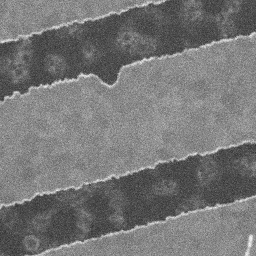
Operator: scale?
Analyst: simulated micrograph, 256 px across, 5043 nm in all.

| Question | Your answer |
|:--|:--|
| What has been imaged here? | one or a few lines or trenches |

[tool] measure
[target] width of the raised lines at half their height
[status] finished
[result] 2040 nm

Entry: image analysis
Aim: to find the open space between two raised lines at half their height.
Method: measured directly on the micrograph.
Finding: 54.9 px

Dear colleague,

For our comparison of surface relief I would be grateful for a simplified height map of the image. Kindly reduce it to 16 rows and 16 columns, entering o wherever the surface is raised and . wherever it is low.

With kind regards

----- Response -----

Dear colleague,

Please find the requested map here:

oooooooo........
oooo............
o.............oo
..........oooooo
........oooooooo
..oooooooooooooo
oooooooooooooooo
oooooooooooooooo
oooooooooooooooo
ooooooooooooo...
ooooooooo.......
ooooo...........
oo.............o
...........ooooo
........oooooooo
....oooooooooooo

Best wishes